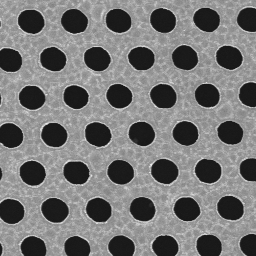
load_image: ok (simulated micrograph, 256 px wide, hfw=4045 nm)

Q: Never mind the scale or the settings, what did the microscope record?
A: a regular array of holes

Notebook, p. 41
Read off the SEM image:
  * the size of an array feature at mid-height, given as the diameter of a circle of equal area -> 0.401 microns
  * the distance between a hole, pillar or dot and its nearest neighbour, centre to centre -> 43.3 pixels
